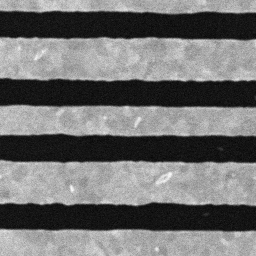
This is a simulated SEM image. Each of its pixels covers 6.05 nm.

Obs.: lines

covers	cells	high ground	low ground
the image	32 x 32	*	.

********************************
...................*****.....*..
................................
................................
................................
********************************
********************************
********************************
********************************
********************************
................................
................................
................................
****************************..*.
********************************
********************************
********************************
................................
................................
................................
********************************
********************************
********************************
********************************
********************************
.....*..**..*.****.....*********
................................
................................
................................
********************************
********************************
********************************